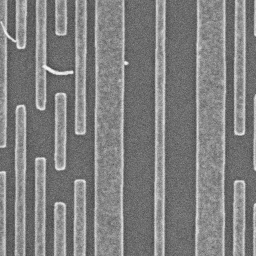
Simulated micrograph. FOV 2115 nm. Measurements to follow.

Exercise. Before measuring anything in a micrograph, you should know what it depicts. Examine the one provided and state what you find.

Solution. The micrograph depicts wiring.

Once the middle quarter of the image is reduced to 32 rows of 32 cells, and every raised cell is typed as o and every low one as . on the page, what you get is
...oo...ooooooo........oo.......
...oo...ooooooo........oo.......
...oo...ooooooo........oo.......
...oo...ooooooo........oo.......
...oo...ooooooo........oo.......
...oo...ooooooo........oo.......
...oo...ooooooo........oo.......
...oo...ooooooo........oo.......
...oo...ooooooo........oo.......
...oo...ooooooo........oo.......
...oo...ooooooo........oo.......
...oo...ooooooo........oo.......
...oo...ooooooo........oo.......
...oo...ooooooo........oo.......
...oo...ooooooo........oo.......
...oo...ooooooo........oo.......
...oo...ooooooo........oo.......
........ooooooo........oo.......
........ooooooo........oo.......
........ooooooo........oo.......
........ooooooo........oo.......
........ooooooo........oo.......
........ooooooo........oo.......
........ooooooo........oo.......
........ooooooo........oo.......
........ooooooo........oo.......
........ooooooo........oo.......
........ooooooo........oo.......
........ooooooo........oo.......
...oo...ooooooo........oo.......
...oo...oooooo.........oo.......
...oo...oooooo.........oo.......